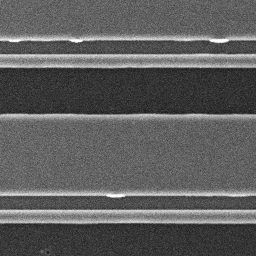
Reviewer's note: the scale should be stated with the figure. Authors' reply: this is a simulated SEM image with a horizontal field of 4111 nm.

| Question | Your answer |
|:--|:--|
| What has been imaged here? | lines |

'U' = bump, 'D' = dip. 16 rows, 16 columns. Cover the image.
UUUUUUUUUUUUUUUU
UUUUUUUUUUUUUUUU
UUUUUUUUUUUUUUUU
UUUUUUUUUUUUUUUU
DDDDDDDDDDDDDDDD
DDDDDDDDDDDDDDDD
DDDDDDDDDDDDDDDD
UUUUUUUUUUUUUUUU
UUUUUUUUUUUUUUUU
UUUUUUUUUUUUUUUU
UUUUUUUUUUUUUUUU
UUUUUUUUUUUUUUUU
UUUUUUUUUUUUUUUU
UUUUUUUUUUUUUUUU
DDDDDDDDDDDDDDDD
DDDDDDDDDDDDDDDD